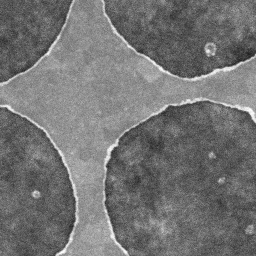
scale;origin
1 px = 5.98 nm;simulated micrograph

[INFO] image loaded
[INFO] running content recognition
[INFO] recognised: holes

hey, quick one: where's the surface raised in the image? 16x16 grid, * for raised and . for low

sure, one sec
....***.........
....***.........
...*****........
...******.......
.*********...***
****************
************..**
..*******.......
...*****........
....***.........
....***.........
.....**.........
.....**.........
.....**.........
.....**.........
....****........